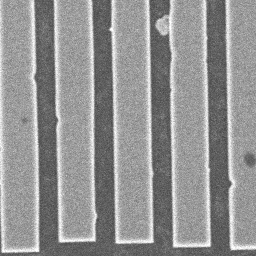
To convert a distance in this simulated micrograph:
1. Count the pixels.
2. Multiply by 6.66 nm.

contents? parallel lines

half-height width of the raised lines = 245 nanometres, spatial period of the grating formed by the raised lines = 381 nm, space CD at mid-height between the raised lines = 135 nm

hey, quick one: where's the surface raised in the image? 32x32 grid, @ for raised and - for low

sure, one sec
@@@@---@@@@---@@@@@--@@@@@--@@@@
@@@@---@@@@---@@@@@--@@@@@--@@@@
@@@@---@@@@@--@@@@@--@@@@@--@@@@
@@@@---@@@@@--@@@@@--@@@@@--@@@@
@@@@---@@@@@--@@@@@--@@@@@--@@@@
@@@@---@@@@@--@@@@@--@@@@@--@@@@
@@@@---@@@@@--@@@@@--@@@@@--@@@@
@@@@---@@@@@--@@@@@--@@@@@--@@@@
@@@@---@@@@@--@@@@@--@@@@@---@@@
@@@@---@@@@@--@@@@@--@@@@@---@@@
@@@@---@@@@@--@@@@@--@@@@@---@@@
@@@@---@@@@@--@@@@@--@@@@@---@@@
@@@@---@@@@@--@@@@@--@@@@@---@@@
@@@@@--@@@@@--@@@@@--@@@@@--@@@@
@@@@@--@@@@@--@@@@@--@@@@@--@@@@
@@@@@--@@@@@--@@@@@--@@@@@---@@@
@@@@@--@@@@@--@@@@@--@@@@@---@@@
@@@@@--@@@@@--@@@@@---@@@@---@@@
@@@@@--@@@@@--@@@@@---@@@@---@@@
@@@@@--@@@@@--@@@@@---@@@@---@@@
@@@@@--@@@@@--@@@@@---@@@@---@@@
@@@@@--@@@@@--@@@@@---@@@@---@@@
@@@@@--@@@@@--@@@@@---@@@@---@@@
@@@@@--@@@@@--@@@@@---@@@@---@@@
@@@@@--@@@@@--@@@@@---@@@@---@@@
@@@@@--@@@@@--@@@@@---@@@@---@@@
@@@@@--@@@@@--@@@@@---@@@@---@@@
@@@@@--@@@@@---@@@@---@@@@---@@@
@@@@@--@@@@@---@@@@---@@@@---@@@
@@@@@--@@@@@---@@@@---@@@@---@@@
@@@@@-----------------@@@@---@@@
--------------------------------